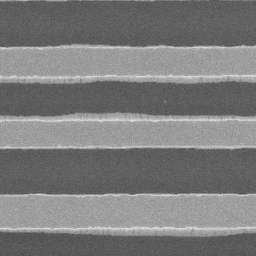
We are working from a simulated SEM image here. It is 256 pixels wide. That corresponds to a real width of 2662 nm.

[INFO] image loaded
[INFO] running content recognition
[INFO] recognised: lines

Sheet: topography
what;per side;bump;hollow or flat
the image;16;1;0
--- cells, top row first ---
0000000000000000
0000000000000000
0000000000000000
1111111111111111
1111111111111111
0000000000000000
0000000000000000
1111111111111111
1111111111111111
0000000000000000
0000000000000000
0000000000000000
1111111111111111
1111111111111111
0000000000000000
0000000000000000